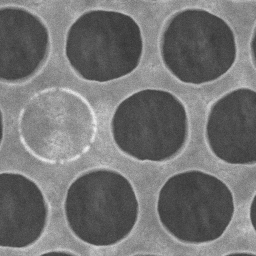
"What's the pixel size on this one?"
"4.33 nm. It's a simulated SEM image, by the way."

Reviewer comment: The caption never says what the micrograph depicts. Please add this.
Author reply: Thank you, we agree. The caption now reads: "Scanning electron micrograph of holes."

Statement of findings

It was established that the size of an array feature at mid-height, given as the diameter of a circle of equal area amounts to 323 nanometres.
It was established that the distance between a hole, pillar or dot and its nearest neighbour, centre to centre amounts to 0.401 micrometres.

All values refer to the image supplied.